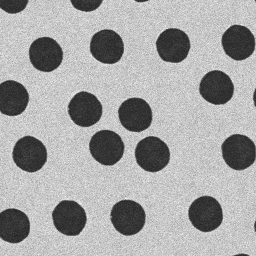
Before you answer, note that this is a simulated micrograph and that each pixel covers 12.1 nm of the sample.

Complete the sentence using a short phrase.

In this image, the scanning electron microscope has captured a regular array of holes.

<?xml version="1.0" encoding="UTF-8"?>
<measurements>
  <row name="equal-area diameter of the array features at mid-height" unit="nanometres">423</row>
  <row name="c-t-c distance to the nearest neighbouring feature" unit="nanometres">708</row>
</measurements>